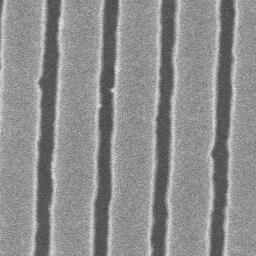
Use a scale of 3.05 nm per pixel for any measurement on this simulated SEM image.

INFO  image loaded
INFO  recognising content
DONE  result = parallel lines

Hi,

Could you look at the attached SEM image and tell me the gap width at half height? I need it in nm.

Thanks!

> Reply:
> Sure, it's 48.8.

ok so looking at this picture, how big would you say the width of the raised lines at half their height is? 131 nanometers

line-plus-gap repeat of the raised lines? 177 nm